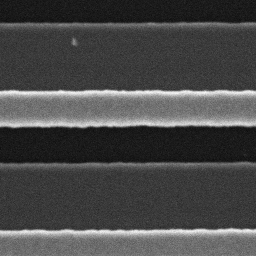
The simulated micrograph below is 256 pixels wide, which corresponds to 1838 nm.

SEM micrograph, lines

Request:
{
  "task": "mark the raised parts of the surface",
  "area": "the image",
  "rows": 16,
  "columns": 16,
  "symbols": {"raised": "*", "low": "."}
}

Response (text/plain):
................
****************
****************
****************
****************
****************
****************
****************
................
................
****************
****************
****************
****************
****************
****************